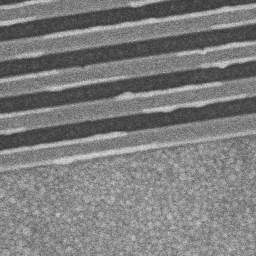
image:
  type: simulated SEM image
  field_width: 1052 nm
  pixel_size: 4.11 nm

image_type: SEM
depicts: parallel lines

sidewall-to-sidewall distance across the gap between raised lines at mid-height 63.5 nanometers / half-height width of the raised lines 84.8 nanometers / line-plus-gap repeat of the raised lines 148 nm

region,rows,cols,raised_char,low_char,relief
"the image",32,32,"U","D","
DDUUUUUUUUUUUUUUUUUDDDDDDDDDDDDU
UUUUUUUUUUUDDDDDDDDDDDDDDUUUUUUU
UUUUUDDDDDDDDDDDDDUUUUUUUUUUUUUU
DDDDDDDDDDDUUUUUUUUUUUUUUUUUDDDD
DDDDDUUUUUUUUUUUUUUUUUDDDDDDDDDD
UUUUUUUUUUUUUUUDDDDDDDDDDDDDUUUU
UUUUUUUUDDDDDDDDDDDDDDUUUUUUUUUU
UDDDDDDDDDDDDDDUUUUUUUUUUUUUUUUU
DDDDDDDDDUUUUUUUUUUUUUUUUUDUDDDD
DDUUUUUUUUUUUUUUUUUDDDDDDDDDDDDD
UUUUUUUUUUUUDDDDDDDDDDDDDUUUUUUU
UUUUUDDDDDDDDDDDDDUUUUUUUUUUUUUU
DDDDDDDDDDDDUUUUUUUUUUUUUUUUUDDD
DDDDDUUUUUUUUUUUUUUUUUUDDDDDDDDD
UUUUUUUUUUUUUUUUDDDDDDDDDDDDDUUU
UUUUUUUUUDDDDDDDDDDDDDUUUUUUUUUU
UUUDDDDDDDDDDDUUUUUUUUUUUUUUUUUU
DDDDDDDDDUUUUUUUUUUUUUUUUUDDDDDD
DDUUUUUUUUUUUUUUUUUDDDDDDDDDDDDD
UUUUUUUUUUUUUDDDDDDDDDDDDDDDDDDD
UUUUUDDUDDDDDDDDDDDDDDDDDDDDDDDD
DDDDDDDDDDDDDDDDDDDDDDDDDDDDDDDD
DDDDDDDDDDDDDDDDDDDDDDDDDDDDDDDD
DDDDDDDDDDDDDDDDDDDDDDDDDDDDDDDD
DDDDDDDDDDDDDDDDDDDDDDDDDDDDDDDD
DDDDDDDDDDDDDDDDDDDDDDDDDDDDDDDD
DDDDDDDDDDDDDDDDDDDDDDDDDDDDDDDD
DDDDDDDDDDDDDDDDDDDDDDDDDDDDDDDD
DDDDDDDDDDDDDDDDDDDDDDDDDDDDDDDD
DDDDDDDDDDDDDDDDDDDDDDDDDDDDDDDD
DDDDDDDDDDDDDDDDDDDDDDDDDDDDDDDD
DDDDDDDDDDDDDDDDDDDDDDDDDDDDDDDD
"